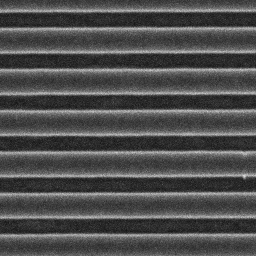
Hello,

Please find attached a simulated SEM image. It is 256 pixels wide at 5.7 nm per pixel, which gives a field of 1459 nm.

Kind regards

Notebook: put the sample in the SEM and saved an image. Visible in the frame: parallel lines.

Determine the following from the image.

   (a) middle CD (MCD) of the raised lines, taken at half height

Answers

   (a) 140 nanometres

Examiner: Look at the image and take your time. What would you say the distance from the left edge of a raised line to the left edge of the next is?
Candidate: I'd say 235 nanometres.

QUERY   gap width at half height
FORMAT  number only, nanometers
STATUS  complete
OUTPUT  97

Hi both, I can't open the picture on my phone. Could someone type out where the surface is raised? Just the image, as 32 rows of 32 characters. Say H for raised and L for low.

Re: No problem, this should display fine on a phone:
HHHHHHHHHHHHHHHHHHHHHHHHHHHHHHHH
LLLLLLLLLLLLLLLLLLLLLLLLLLLLLLLL
LLLLLLLLLLLLLLLLLLLLLLLLLLLLLLLL
LLLLLLLLLLLLLLLLLLLLLLLHHHHHLLLL
HHHHHHHHHHHHHHHHHHHHHHHHHHHHHHHH
HHHHHHHHHHHHHHHHHHHHHHHHHHHHHHHH
HHHHLHHHHHHHHHHHHLLLLHHHLLLLHHHL
LLLLLLLLLLLLLLLLLLLLLLLLLLLLLLLL
LLLLLLLLLLLLLLLLLLLLLLLLLLLLLLLL
HHHHHHHHHHHHHHHHHHHHHHHHHHHHHHHH
HHHHHHHHHHHHHHHHHHHHHHHHHHHHHHHH
HHHHHHHHHHHHHHHHHHHHHHHHHHHHHHHH
LLLLLLLLLLLLLLLLLLLLLLLLLLLLLLLL
LLLLLLLLLLLLLLLLLLLLLLLLLLLLLLLL
HHHHHHHHHHHHHHHHHHHHHHHHHHHHHHHH
HHHHHHHHHHHHHHHHHHHHHHHHHHHHHHHH
HHHHHHHHHHHHHHHHHHHHHHHHHHHHHHHH
LLLLLLLLLLLLLLLLLLLLLLLLLLLLLLLL
LLLLLLLLLLLLLLLLLLLLLLLLLLLLLLLL
HHHHHHHHHHHHHHHHHHHHHHHHHHHHHHHH
HHHHHHHHHHHHHHHHHHHHHHHHHHHHHHHH
HHHHHHHHHHHHHHHHHHHHHHHHHHHHHHHH
LLLLLLLLLLLLLLLLLLLLLLLLLLLLLLLL
LLLLLLLLLLLLLLLLLLLLLLLLLLLLLLLL
HHHHHHHHHHHHHHHHHHHHHHHHHHHHHHHH
HHHHHHHHHHHHHHHHHHHHHHHHHHHHHHHH
HHHHHHHHHHHHHHHHHHHHHHHHHHHHHHHH
LLLLLLLLLLLLLLLLLLLLLLLLLLLLLLLL
LLLLLLLLLLLLLLLLLLLLLLLLLLLLLLLL
HHHHHHHHHHHHHHHHHHHHHHHHHHHHHHHH
HHHHHHHHHHHHHHHHHHHHHHHHHHHHHHHH
HHHHHHHHHHHHHHHHHHHHHHHHHHHHHHHH